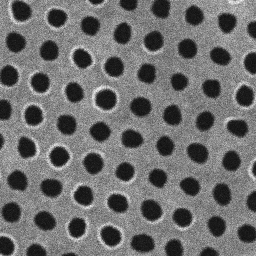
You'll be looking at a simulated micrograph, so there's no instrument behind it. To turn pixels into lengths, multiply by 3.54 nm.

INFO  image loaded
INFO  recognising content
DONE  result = a regular array of holes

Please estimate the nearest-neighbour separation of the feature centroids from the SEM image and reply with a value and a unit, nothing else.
116 nm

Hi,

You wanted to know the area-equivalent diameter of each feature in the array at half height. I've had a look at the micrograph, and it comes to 70.2 nanometers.